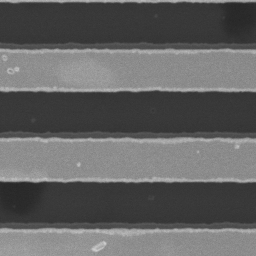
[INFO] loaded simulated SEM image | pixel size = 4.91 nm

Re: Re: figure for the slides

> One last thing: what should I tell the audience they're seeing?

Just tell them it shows lines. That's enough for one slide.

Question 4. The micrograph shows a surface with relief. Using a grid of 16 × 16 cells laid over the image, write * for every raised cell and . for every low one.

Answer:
................
................
................
****************
****************
****************
................
................
****************
****************
****************
................
................
................
****************
****************